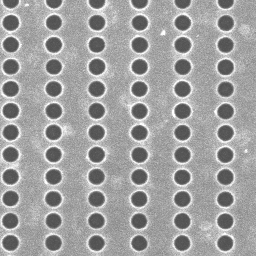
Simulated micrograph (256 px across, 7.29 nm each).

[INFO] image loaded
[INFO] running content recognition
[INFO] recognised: a regular array of holes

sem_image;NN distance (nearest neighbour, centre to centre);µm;0.159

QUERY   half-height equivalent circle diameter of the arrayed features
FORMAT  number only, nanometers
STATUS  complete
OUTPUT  112